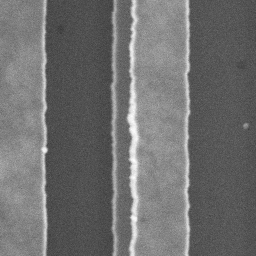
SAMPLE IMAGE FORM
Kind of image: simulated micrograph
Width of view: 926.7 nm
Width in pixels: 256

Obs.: lines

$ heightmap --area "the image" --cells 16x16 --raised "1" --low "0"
1110000011110000
1110000011110000
1110000011110000
1110000011110000
1110000011110000
1110000011110000
1110000011110000
1110000011110000
1110000011110000
1110000011110000
1110000011110000
1110000011110000
1110000011110000
1110000011110000
1110000011110000
1110000011110000